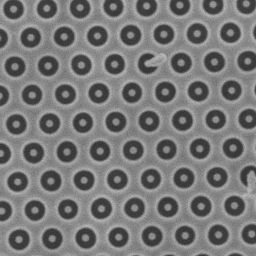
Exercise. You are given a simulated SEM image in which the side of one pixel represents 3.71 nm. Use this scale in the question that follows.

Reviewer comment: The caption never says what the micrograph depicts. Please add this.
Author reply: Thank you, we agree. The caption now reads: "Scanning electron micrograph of an array of small figures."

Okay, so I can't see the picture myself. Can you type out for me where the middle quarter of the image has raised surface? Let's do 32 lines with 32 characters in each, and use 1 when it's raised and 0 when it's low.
11001001110000011100001111100000
11000001110000011110000111100001
11100011111000111111001111111011
11111111111111111111111111111111
11111111111111110011111100011111
00111110000111100001111000001110
00011100000111000000111001001110
00011100100011000000111001001110
00011100000111100001111000001110
00111110001111100001111100011111
11111111111111111111111111111111
11111111111111111111001111111001
11100011111000011110000111100000
11000001110000001110000011100000
11001001110000001100010011100100
11000001110000001110000011100000
11100001111000011111000111110001
11111111111111111111111111111111
11111111111111111111111111111111
00111110001111100001111100001111
00011110000111100000111000001110
00011100000011100000111000000110
00011100000011100000111000001111
00011110000111100001111100011111
00111111001111111111111111111111
11111111111111111111111111111111
11110011111100011111000111110000
11100001111000001110000011100000
11000000110000001110000011100000
11000000111000001110000011100000
11100001111000001111000011110000
11110011111110111111111111111111